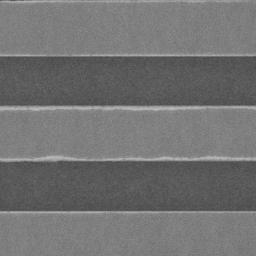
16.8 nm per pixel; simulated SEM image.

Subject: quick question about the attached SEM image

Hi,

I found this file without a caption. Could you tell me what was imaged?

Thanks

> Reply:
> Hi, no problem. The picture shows lines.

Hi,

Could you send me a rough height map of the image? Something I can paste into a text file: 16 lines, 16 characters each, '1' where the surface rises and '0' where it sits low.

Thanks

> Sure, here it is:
1111111111111111
1111111111111111
1111111111111111
0000000000000000
0000000000000000
0000000000000000
0000000000000000
1111111111111111
1111111111111111
1111111111111111
0000000000000000
0000000000000000
0000000000000000
1111111111111111
1111111111111111
1111111111111111